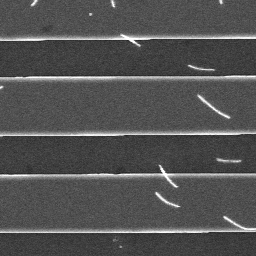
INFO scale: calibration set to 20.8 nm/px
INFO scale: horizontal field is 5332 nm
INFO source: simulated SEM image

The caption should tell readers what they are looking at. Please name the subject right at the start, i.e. lines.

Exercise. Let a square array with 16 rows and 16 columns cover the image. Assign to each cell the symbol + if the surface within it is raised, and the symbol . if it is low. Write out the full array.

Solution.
++++++++++++++++
++++++++++++++++
+++.............
................
................
++++++++++++++++
++++++++++++++++
++++++++++++++++
................
................
................
++++++++++++++++
++++++++++++++++
++++++++++++++++
+++++++++++.....
................